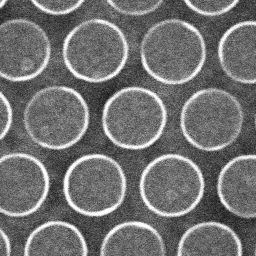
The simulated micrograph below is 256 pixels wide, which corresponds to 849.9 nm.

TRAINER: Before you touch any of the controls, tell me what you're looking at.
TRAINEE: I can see raised bodies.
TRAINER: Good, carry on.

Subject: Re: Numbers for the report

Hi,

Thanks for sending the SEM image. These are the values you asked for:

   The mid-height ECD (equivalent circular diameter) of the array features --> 205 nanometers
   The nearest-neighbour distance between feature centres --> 0.256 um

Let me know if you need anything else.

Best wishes